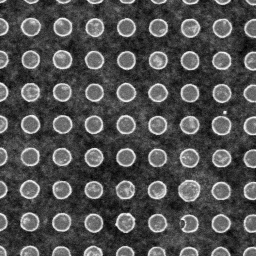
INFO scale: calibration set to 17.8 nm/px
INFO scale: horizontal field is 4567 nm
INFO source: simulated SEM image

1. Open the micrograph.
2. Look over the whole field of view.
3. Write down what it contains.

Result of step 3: a regular array of raised bodies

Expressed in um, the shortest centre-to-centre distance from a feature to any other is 0.566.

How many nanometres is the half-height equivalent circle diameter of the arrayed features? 314